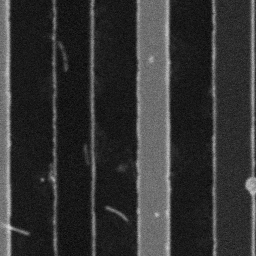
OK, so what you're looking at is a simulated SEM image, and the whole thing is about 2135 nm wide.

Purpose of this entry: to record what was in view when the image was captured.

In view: lines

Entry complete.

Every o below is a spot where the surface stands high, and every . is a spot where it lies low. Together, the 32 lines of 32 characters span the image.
o......ooooo.....oooo......ooooo
o......ooooo.....oooo......ooooo
o......ooooo.....oooo......ooooo
o......ooooo.....oooo......ooooo
o......ooooo.....oooo......ooooo
o......ooooo.....oooo......ooooo
o......ooooo.....oooo......ooooo
o......ooooo.....oooo......ooooo
o......ooooo.....oooo......ooooo
o......ooooo.....oooo......ooooo
o......ooooo.....oooo......ooooo
o......ooooo.....oooo......ooooo
o......ooooo.....oooo......ooooo
o......ooooo.....oooo......ooooo
o......ooooo.....oooo......ooooo
o......ooooo.....oooo......ooooo
o......ooooo.....oooo......ooooo
o......ooooo.....oooo......ooooo
o......ooooo.....oooo......ooooo
o......ooooo.....oooo......ooooo
o......ooooo.....oooo......ooooo
o......ooooo.....oooo......ooooo
o......ooooo.....oooo......ooooo
o......ooooo.....oooo......ooooo
o......ooooo.....oooo......ooooo
o......ooooo.....oooo......ooooo
o......ooooo.....oooo......ooooo
o......ooooo.....oooo......ooooo
o......ooooo.....oooo......ooooo
o......ooooo.....oooo......ooooo
o......ooooo.....oooo......ooooo
o......ooooo.....oooo......ooooo